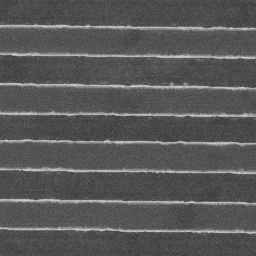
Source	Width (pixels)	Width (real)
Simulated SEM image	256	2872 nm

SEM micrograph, lines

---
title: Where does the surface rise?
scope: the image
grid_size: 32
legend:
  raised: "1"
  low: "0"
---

00000000000000000000000000000000
00000000000000000000000000000000
00000000000000000000000000000000
11111111111111111111111111010000
11111111111111111111111111111111
11111111111111111111111111111111
11111111111111111111111111111111
00000000000000000000000000000000
00000000000000000000000000000000
00000000000000000000000000000000
11100000000000000000000000000000
11111111111111111111111111111111
11111111111111111111111111111111
11111111111111111111111111111111
00000000000000000000001011011111
00000000000000000000000000000000
00000000000000000000000000000000
00010000000000000000000000000000
11111111111111111111111111111111
11111111111111111111111111111111
11111111111111111111111111111111
00000000000000000000111111111111
00000000000000000000000000000000
00000000000000000000000000000000
00000000000000000000000000000000
11111111111111111111111111111111
11111111111111111111111111111111
11111111111111111111111111111111
11111111111111111111111111111111
00000000000000000000000000000000
00000000000000000000000000000000
00000000000000000000000000000000